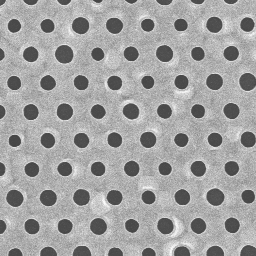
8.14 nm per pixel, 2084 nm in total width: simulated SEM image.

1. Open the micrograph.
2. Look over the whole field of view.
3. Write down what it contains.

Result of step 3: a regular array of holes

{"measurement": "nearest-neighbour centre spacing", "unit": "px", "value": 32.9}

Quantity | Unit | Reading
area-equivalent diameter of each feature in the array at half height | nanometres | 123